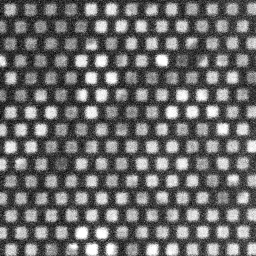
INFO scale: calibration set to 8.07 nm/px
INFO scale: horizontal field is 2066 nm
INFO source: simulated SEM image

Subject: a regular array of raised bodies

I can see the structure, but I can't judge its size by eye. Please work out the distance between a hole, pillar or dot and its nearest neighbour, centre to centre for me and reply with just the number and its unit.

159 nanometres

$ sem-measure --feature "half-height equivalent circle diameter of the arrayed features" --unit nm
88.3